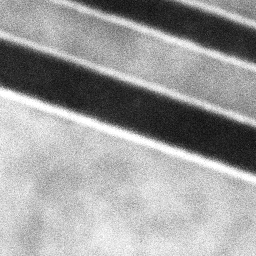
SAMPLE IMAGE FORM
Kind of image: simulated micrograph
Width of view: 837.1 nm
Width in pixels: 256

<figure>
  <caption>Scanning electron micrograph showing one or a few lines or trenches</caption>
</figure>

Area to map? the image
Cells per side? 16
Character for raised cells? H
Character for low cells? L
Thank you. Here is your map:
LLLLLHHHHHHHHLLL
LLLLLLLLHHHHHHHH
HLLLLLLLLLLHHHHH
HHHHLLLLLLLLLHHH
HHHHHHHLLLLLLLLL
HHHHHHHHHHLLLLLL
LLHHHHHHHHHHHLLL
LLLLLHHHHHHHHHHH
LLLLLLLLHHHHHHHH
LLLLLLLLLLLHHHHH
LLLLLLLLLLLLLLHH
LLLLLLLLLLLLLLLL
LLLLLLLLLLLLLLLL
LLLLLLLLLLLLLLLL
LLLLLLLLLLLLLLLL
LLLLLLLLLLLLLLLL